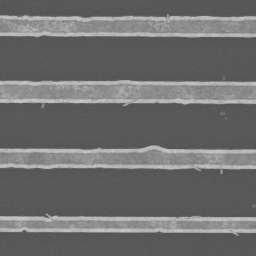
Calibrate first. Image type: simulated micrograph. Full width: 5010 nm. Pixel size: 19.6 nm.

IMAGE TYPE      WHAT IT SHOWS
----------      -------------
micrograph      one or a few lines or trenches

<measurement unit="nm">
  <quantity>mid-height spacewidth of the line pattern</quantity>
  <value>976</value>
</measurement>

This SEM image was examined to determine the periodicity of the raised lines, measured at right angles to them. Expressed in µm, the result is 1.29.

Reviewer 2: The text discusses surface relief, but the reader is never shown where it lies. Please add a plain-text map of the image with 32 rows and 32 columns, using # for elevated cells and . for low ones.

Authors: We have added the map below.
................................
................................
################################
################################
................................
................................
................................
................................
................................
................................
#####################.##..####..
################################
################################
................................
................................
................................
................................
................................
...................#............
################################
################################
................................
................................
................................
................................
................................
................................
##########################.#####
################################
................................
................................
................................